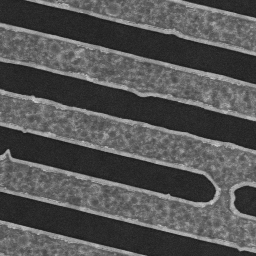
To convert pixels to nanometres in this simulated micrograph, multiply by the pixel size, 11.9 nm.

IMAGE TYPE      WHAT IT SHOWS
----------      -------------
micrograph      one or a few lines or trenches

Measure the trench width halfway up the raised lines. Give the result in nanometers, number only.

374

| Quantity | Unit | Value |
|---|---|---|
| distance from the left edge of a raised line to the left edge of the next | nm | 763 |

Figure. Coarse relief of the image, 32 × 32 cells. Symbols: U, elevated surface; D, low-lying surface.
DDDDDDUUUUUUUUUUUUUUUUUDDDDDDDDD
DDDDDDDDDDDUUUUUUUUUUUUUUUUUDDDD
DDDDDDDDDDDDDDDUUUUUUUUUUUUUUUUU
UUDDDDDDDDDDDDDDDDDUUUUUUUUUUUUU
UUUUUUDDDDDDDDDDDDDDDDDUUUUUUUUU
UUUUUUUUUUDDDDDDDDDDDDDDDDDUUUUU
UUUUUUUUUUUUUUDDDDDDDDDDDDDDDDDU
DUUUUUUUUUUUUUUUUUDDDDDDDDDDDDDD
DDDDDDUUUUUUUUUUUUUUUUDDDDDDDDDD
DDDDDDDDDDUUUUUUUUUUUUUUUUUDDDDD
DDDDDDDDDDDDDUUUUUUUUUUUUUUUUUUD
DDDDDDDDDDDDDDDDDUUUUUUUUUUUUUUU
UUUUUDDDDDDDDDDDDDDDDDUUUUUUUUUU
UUUUUUUUDDDDDDDDDDDDDDDDDDUUUUUU
UUUUUUUUUUUUUDDDDDDDDDDDDDDDDDUU
UUUUUUUUUUUUUUUUUUDDDDDDDDDDDDDD
DDDDUUUUUUUUUUUUUUUUUDDDDDDDDDDD
DDDDDDDDDUUUUUUUUUUUUUUUUUDDDDDD
DDDDDDDDDDDDUUUUUUUUUUUUUUUUUUDD
UDDDDDDDDDDDDDDDDUUUUUUUUUUUUUUU
UUUUDDDDDDDDDDDDDDDDDUUUUUUUUUUU
UUUUUUUUDDDDDDDDDDDDDDDDDUUUUUUU
UUUUUUUUUUUUDDDDDDDDDDDDDDUUUUUU
UUUUUUUUUUUUUUUUDDDDDDDDDDDUUDDD
DDDDUUUUUUUUUUUUUUUUDDDDDDDUUDDD
DDDDDDDDUUUUUUUUUUUUUUUUUDUUUDDD
DDDDDDDDDDDDUUUUUUUUUUUUUUUUUDDD
DDDDDDDDDDDDDDDDUUUUUUUUUUUUUUUU
UUUDDDDDDDDDDDDDDDDDUUUUUUUUUUUU
UUUUUUUDDDDDDDDDDDDDDDDDUUUUUUUU
UUUUUUUUUUUDDDDDDDDDDDDDDDDDDUUU
UUUUUUUUUUUUUUUDDDDDDDDDDDDDDDDD